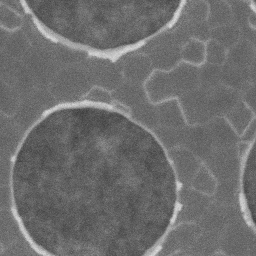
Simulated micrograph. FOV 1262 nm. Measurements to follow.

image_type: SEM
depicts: holes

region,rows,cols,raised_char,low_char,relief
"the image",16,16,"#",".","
##.........#####
###.......######
####.....#######
################
################
################
################
###.....########
##........######
#.........######
#..........####.
#..........####.
#..........####.
#..........#####
##........######
##.......#######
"